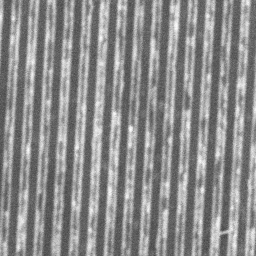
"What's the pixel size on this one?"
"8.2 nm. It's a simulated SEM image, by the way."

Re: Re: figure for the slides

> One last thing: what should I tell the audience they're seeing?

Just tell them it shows parallel lines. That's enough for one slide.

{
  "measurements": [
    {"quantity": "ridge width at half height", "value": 59.3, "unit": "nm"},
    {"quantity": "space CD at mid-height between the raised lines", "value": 9.85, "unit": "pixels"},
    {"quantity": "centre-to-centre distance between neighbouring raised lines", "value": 144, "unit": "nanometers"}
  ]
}